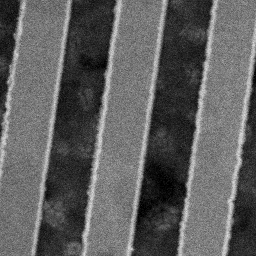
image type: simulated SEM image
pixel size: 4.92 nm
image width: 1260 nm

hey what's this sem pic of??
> one or a few lines or trenches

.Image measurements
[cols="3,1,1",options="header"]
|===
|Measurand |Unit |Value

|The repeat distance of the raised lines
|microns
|0.467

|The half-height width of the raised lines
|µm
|0.218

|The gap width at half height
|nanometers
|249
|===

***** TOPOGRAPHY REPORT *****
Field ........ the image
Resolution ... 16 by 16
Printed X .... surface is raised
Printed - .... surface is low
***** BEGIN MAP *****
-XXX---XXX---XXX
-XXX---XXX---XXX
-XXX---XXX---XXX
-XXX---XXX---XXX
-XXX---XXX---XXX
-XXX---XXX---XXX
-XX----XX----XX-
XXX---XXX---XXX-
XXX---XXX---XXX-
XXX---XXX---XXX-
XXX---XXX---XXX-
XXX---XXX---XXX-
XXX---XX----XX--
XX----XX----XX--
XX---XXX---XXX--
XX---XXX---XXX--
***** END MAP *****